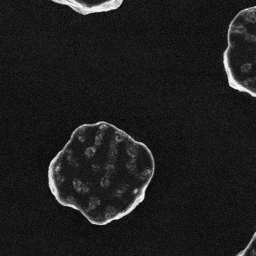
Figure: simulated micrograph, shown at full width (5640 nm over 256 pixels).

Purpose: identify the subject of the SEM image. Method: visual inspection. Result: raised bodies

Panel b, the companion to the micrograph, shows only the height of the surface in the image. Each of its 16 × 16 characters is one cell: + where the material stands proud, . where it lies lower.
.....++.........
..............++
..............++
..............++
..............++
...............+
................
................
....++++........
....+++++.......
...+++++++......
...++++++.......
....+++++.......
.....+++........
................
...............+